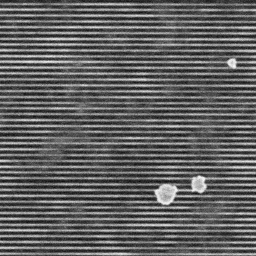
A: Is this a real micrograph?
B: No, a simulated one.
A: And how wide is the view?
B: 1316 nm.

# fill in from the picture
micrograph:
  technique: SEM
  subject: parallel lines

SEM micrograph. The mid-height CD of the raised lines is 5.1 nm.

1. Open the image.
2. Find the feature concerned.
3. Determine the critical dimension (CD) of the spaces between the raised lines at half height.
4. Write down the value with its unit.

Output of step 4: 25.1 nanometers